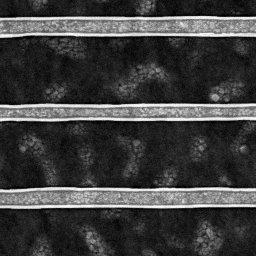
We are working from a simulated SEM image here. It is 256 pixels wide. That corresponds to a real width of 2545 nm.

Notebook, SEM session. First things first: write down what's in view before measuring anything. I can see one or a few lines or trenches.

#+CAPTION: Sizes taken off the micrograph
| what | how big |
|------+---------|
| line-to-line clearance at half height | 70.4 pixels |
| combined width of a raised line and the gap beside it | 0.851 micrometres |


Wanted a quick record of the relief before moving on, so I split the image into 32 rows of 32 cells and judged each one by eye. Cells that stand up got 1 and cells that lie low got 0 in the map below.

00000000000000000000000000000000
00000000000000000000000000000000
11111111111111111111111111111111
11111111111111111111111111111111
00000000000000000000000000000000
00000000000000000000000000000000
00000000000000000000000000000000
00000000000000000000000000000000
00000000000000000000000000000000
00000000000000000000000000000000
00000000000000000000000000000000
00000000000000000000000000000000
00000000000000000000000000000000
11111111111111111111111111111111
11111111111111111111111111111111
00000000000000000000000000000000
00000000000000000000000000000000
00000000000000000000000000000000
00000000000000000000000000000000
00000000000000000000000000000000
00000000000000000000000000000000
00000000000000000000000000000000
00000000000000000000000000000000
00000000000000000000000000000000
11111111111111111111111111111111
11111111111111111111111111111111
00000000000000000000000000000000
00000000000000000000000000000000
00000000000000000000000000000000
00000000000000000000000000000000
00000000000000000000000000000000
00000000000000000000000000000000